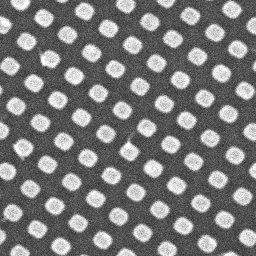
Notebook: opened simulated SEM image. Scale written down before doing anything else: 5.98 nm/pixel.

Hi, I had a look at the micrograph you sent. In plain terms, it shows a regular array of raised bodies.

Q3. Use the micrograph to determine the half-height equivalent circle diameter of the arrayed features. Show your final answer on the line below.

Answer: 0.0983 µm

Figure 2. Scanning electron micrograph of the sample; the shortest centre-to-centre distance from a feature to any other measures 172 nanometers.